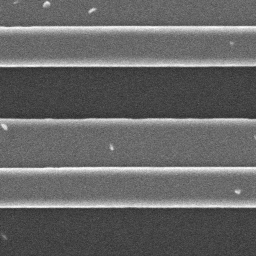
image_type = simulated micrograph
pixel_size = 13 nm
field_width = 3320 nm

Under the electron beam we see lines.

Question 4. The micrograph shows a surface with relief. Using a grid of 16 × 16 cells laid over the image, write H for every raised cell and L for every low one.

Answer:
HHHHHHHHHHHHHHHH
HHHHHHHHHHHHHHHH
HHHHHHHHHHHHHHHH
HHHHHHHHHHHHHHHH
LLLLLLLLLLLLLLLL
LLLLLLLLLLLLLLLL
LLLLLLLLLLLLLLLL
HHHHHHHHHHHHHHHH
HHHHHHHHHHHHHHHH
HHHHHHHHHHHHHHHH
HHHHHHHHHHHHHHHH
HHHHHHHHHHHHHHHH
HHHHHHHHHHHHHHHH
LLLLLLLLLLLLLLLL
LLLLLLLLLLLLLLLL
LLLLLLLLLLLLLLLL